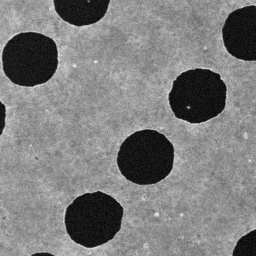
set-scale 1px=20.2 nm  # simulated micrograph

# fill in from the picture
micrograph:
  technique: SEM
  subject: holes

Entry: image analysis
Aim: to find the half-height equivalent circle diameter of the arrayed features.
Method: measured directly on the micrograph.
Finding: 1160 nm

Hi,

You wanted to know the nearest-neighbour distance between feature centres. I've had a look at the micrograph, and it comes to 1630 nm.